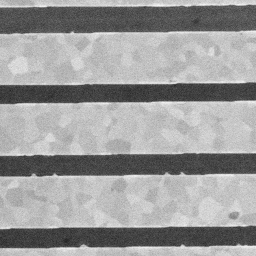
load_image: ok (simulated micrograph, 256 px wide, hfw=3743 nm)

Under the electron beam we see lines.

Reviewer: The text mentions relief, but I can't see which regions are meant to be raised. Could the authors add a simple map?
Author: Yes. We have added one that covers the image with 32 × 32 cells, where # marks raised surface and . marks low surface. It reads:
################################
................................
................................
................................
################################
################################
################################
################################
################################
################################
############....................
................................
................................
################################
################################
################################
################################
################################
################################
................................
................................
................................
################################
################################
################################
################################
################################
################################
##..............................
................................
................................
################################